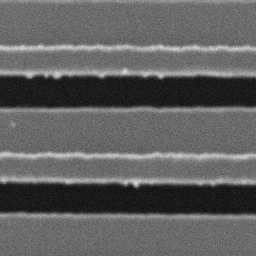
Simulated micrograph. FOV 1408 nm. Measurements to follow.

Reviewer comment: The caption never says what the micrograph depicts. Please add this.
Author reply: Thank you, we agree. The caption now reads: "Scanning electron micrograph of lines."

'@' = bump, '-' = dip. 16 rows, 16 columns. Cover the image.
@@@@@@@@@@@@@@@@
@@@@@@@@@@@@@@@@
@@@@@@@@@@@@@@@@
@@@@@@@@@@@@@@@@
@@@@@@@@@@@@@@@@
----------------
----------------
@@@@@@@@@@@@@@@@
@@@@@@@@@@@@@@@@
@@@@@@@@@@@@@@@@
@@@@@@@@@@@@@@@@
----------------
----------------
@@@@@@@@@@@@@---
@@@@@@@@@@@@@@@@
@@@@@@@@@@@@@@@@